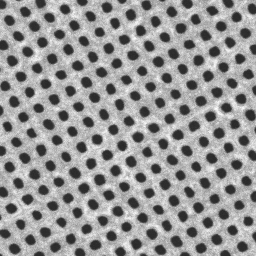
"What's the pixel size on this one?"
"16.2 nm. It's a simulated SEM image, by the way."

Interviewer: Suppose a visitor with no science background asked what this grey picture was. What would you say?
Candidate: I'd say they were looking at a regular array of holes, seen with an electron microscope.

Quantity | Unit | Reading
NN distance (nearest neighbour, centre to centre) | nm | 288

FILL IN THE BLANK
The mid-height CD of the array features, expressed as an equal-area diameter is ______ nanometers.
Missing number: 173